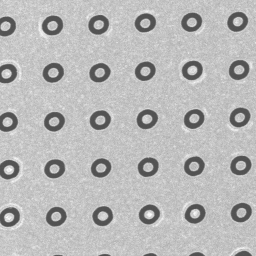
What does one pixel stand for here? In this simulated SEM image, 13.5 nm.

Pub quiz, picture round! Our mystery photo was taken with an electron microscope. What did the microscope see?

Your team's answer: a regular array of ring-shaped grooves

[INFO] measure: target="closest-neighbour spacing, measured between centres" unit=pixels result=46.1